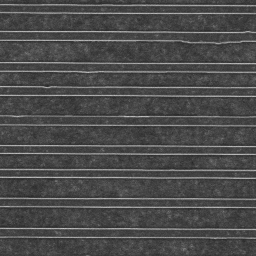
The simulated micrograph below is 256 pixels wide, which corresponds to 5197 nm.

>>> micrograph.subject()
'parallel lines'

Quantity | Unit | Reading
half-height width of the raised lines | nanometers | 188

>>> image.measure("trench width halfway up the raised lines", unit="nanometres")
411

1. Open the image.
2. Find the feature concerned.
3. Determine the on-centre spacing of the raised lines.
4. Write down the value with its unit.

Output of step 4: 568 nm